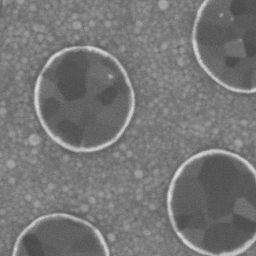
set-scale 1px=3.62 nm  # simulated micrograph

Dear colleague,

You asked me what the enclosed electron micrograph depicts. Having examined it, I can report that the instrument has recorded raised bodies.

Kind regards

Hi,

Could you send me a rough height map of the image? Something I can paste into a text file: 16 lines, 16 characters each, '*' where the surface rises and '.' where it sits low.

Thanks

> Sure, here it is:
.............***
............****
............****
...****.....****
...*****.....***
..******......**
..******........
...*****........
...****.........
.............*..
...........*****
...........*****
...........*****
...*.......*****
.*****.....*****
.******.....***.